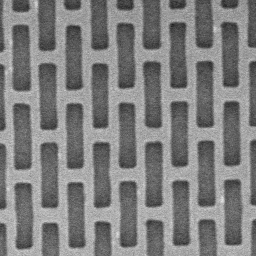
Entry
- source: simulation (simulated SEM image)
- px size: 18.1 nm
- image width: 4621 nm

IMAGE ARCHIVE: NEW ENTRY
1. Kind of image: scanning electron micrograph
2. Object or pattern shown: groups of lines, slits or small figures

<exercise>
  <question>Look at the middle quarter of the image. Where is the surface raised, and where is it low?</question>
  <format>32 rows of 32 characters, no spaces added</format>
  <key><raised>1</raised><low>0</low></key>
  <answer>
00000110000110000010000011000001
00000110000110000010000011000001
00000110000110000011000011000001
00000110000110000011000011000001
00000110000110000011000011000001
00000110000110000011000011000001
00001110000111111111000011111111
11111110000111111111000011111111
11111110000111111111000011111111
11111110000111111111000011100001
00000110000110000011000011000001
00000110000110000011000001000001
00000110000111000011000001000001
00000110000111000011000001000001
00000110000111000011000001000001
00000110000111000011000011000001
00000111111111000011111111000001
00000111111111000011111111000001
00000111111111000011111111000001
00000111000111000011100011000001
00000110000011000011000001000001
00000110000011000011000001000001
00000110000010000011000001000001
00000110000010000011000001000001
00000110000011000011000001100001
10000110000011000011000001100001
10001110000011111111000001111111
11111110000011111111000001111111
11111110000011111111000001111111
10001110000011000011000001100001
10000110000011000011000001100001
10000110000011000011000001100001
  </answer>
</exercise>